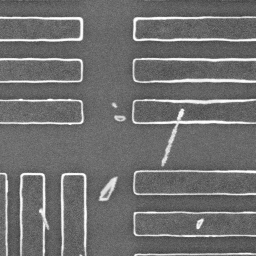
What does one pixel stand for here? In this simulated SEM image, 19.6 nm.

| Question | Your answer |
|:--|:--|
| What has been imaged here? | groups of lines, slits or small figures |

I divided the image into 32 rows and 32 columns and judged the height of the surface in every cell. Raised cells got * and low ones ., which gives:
................................
................................
**********.......***************
**********.......***************
**********.......***************
................................
................................
********.........*********......
**********.......***************
**********.......***************
................................
................................
................................
**********.......***************
**********.......***************
................................
................................
................................
................................
................................
................................
.................***************
*..**...***......***************
*..**...***..*...***************
*..**...***..*..................
*..**...***.....................
*..**...***.....................
*..***..***......***************
*..**...***......***************
*..**...***.....................
*..**...***.....................
*..**...***.....................